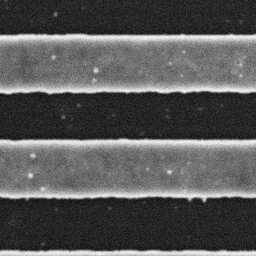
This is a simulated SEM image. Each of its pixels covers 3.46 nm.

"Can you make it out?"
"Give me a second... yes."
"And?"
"lines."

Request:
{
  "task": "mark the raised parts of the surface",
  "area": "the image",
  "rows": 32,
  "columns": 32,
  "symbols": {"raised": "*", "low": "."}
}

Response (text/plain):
................................
................................
................................
................................
*.***************.**************
********************************
********************************
********************************
********************************
********************************
********************************
****.*******...***..**.*......**
................................
................................
................................
................................
................................
...............*................
********************************
********************************
********************************
********************************
********************************
********************************
********************************
................................
................................
................................
................................
................................
................................
********************************